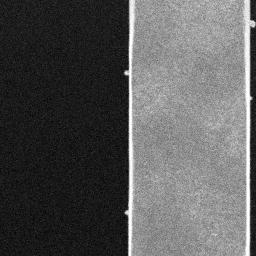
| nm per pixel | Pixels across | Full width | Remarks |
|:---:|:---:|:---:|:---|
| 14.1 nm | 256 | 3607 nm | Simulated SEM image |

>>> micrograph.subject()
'wiring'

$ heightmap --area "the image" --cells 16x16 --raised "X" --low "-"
--------XXXXXXX-
--------XXXXXXX-
--------XXXXXXX-
--------XXXXXXX-
--------XXXXXXX-
--------XXXXXXX-
--------XXXXXXX-
--------XXXXXXX-
--------XXXXXXX-
--------XXXXXXX-
--------XXXXXXX-
--------XXXXXXX-
--------XXXXXXX-
--------XXXXXXX-
--------XXXXXXX-
--------XXXXXXX-